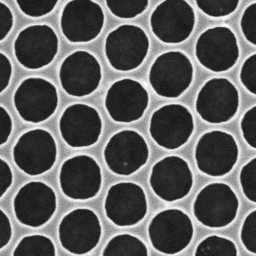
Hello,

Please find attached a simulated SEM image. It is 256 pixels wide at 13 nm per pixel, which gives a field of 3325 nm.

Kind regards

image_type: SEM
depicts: a regular array of holes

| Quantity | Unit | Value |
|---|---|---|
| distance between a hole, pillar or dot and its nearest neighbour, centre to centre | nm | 672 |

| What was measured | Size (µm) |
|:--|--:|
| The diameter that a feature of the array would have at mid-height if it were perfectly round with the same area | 0.573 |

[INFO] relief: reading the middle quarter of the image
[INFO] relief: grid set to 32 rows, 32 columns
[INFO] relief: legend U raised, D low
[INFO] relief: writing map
DDDDDDDDDUUUDDDDDDDUUUDDDDDDDDDD
DDDDDDDDDUUUUUDDUUUUUUDDDDDDDDDD
DDDDDDDDDUUUUUUUUUUUUDDDDDDDDDDD
DDDDDDDDDUUUUUUUUUUUUDDDDDDDDDDD
DDDDDDDDDUUUUDDDDDDUUDDDDDDDDDDD
DDDDDDDDUUUUDDDDDDDDUUDDDDDDDDDU
DDDDDDDDUUUDDDDDDDDDUUDDDDDDDDUU
UDDDDDUUUUUDDDDDDDDDDUUDDDDDDUUU
UUUUUUUUUUDDDDDDDDDDDUUUUUDDUUUU
UUUUUUUUUUDDDDDDDDDDDUUUUUUUUUUU
UDDDDDUUUUDDDDDDDDDDDUUUUDDDDDUU
DDDDDDDDUUUDDDDDDDDDUUUDDDDDDDDU
DDDDDDDDDUUDDDDDDDDDUUDDDDDDDDDD
DDDDDDDDDUUUDDDDDDDUUUDDDDDDDDDD
DDDDDDDDDUUUUUDDDUUUUUDDDDDDDDDD
DDDDDDDDDUUUUUUUUUUUUDDDDDDDDDDD
DDDDDDDDDUUUUUUDDUUUUDDDDDDDDDDD
DDDDDDDDDUUUUDDDDDDUUUDDDDDDDDDD
DDDDDDDDDUUUDDDDDDDDUUDDDDDDDDDU
UDDDDDDDUUUDDDDDDDDDUUUDDDDDDDDU
UUDDDDUUUUDDDDDDDDDDDUUUDDDDDUUU
UUUUUUUUUUDDDDDDDDDDDUUUUUUUUUUU
UUUUUUUUUUDDDDDDDDDDDUUUUUUUUUUU
UUDDDDDUUUDDDDDDDDDDDUUUUDDDDUUU
DDDDDDDDUUDDDDDDDDDDDUUDDDDDDDDU
DDDDDDDDDUUDDDDDDDDUUUDDDDDDDDDU
DDDDDDDDDUUUDDDDDDUUUUDDDDDDDDDU
DDDDDDDDDUUUUDDDDUUUUUDDDDDDDDDD
DDDDDDDDDUUUUUUUUUUUUDDDDDDDDDDD
DDDDDDDDDUUUUUUUUUUUUDDDDDDDDDDD
DDDDDDDDDUUUDDDDDDDUUUDDDDDDDDDD
DDDDDDDDDUUDDDDDDDDDUUDDDDDDDDDD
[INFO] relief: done